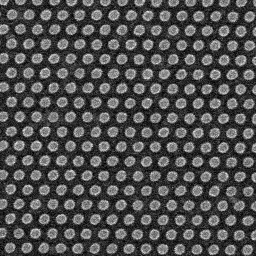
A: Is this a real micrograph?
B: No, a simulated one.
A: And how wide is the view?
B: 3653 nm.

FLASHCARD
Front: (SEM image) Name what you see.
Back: a regular array of raised bodies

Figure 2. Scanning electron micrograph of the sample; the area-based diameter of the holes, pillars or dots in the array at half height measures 137 nm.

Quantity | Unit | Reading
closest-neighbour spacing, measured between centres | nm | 237